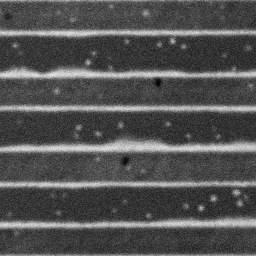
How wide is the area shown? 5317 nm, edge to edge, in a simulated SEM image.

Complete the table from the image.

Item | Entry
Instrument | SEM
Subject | lines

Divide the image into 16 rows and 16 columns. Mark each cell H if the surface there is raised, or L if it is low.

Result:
LLLLLLLLLLLLLLLL
LLLLLLLLLLLLLLLL
HHHHHHHHHHHHHHHH
HHHHHHHHHHHHHHHH
HHHHHHHHHHHHHHHH
LLLLLLLLLLLLLLLL
LLLLLLLLLLLLLLLL
HHHHHHHHHHHHHHHH
HHHHHHHHHHHHHHHH
LLLLLLLLLLLLLLLL
LLLLLLLLLLLLLLLL
HHHHHHHHHHHHHHHH
HHHHHHHHHHHHHHHH
HHHHHHHHHHHHHHHH
LLLLLLLLLLLLLLLL
LLLLLLLLLLLLLLLL